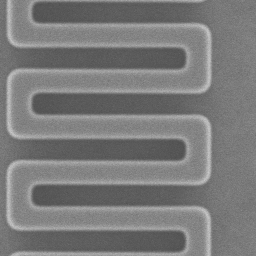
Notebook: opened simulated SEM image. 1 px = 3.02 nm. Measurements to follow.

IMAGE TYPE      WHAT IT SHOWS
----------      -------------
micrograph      groups of lines, slits or small figures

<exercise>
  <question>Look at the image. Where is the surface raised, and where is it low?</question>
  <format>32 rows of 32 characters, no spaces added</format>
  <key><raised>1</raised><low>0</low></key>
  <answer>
01110000000000000000000000000000
01110000000000000000000000000000
01110000000000000000000000000000
01111111111111111111111111000000
01111111111111111111111111000000
00111111111111111111111111000000
00000000000000000000000111000000
00000000000000000000000111000000
00000000000000000000000111000000
01111111111111111111111111000000
01111111111111111111111111000000
01111111111111111111111110000000
01110000000000000000000000000000
01110000000000000000000000000000
01111111111111111111111110000000
01111111111111111111111111000000
01111111111111111111111111000000
00000000000000000000000111000000
00000000000000000000000111000000
00000000000000000000000111000000
00111111111111111111111111000000
01111111111111111111111111000000
01111111111111111111111111000000
01110000000000000000000000000000
01110000000000000000000000000000
01110000000000000000000000000000
01111111111111111111111111000000
01111111111111111111111111000000
00111111111111111111111111000000
00000000000000000000000111000000
00000000000000000000000111000000
00000000000000000000001111000000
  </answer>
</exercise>